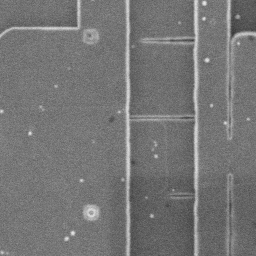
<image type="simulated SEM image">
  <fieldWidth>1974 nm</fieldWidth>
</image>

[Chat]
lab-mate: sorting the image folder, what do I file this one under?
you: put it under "wiring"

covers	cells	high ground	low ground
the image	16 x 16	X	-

-----XXX----XX--
-----XXX----XX--
XXXXXXXX----XXXX
XXXXXXXX----XXXX
XXXXXXXX----XXXX
XXXXXXXX----XXXX
XXXXXXXX----XXXX
XXXXXXXX----XXXX
XXXXXXXX----XXXX
XXXXXXXX----XXXX
XXXXXXXX----XXXX
XXXXXXXX----XXXX
XXXXXXXX----XXXX
XXXXXXXX----XXXX
XXXXXXXX----XXXX
XXXXXXXX----XXXX